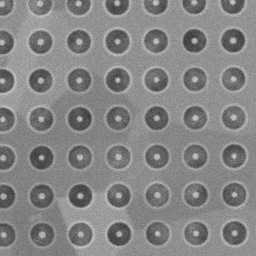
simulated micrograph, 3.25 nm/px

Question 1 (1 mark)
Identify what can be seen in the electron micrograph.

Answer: an array of small figures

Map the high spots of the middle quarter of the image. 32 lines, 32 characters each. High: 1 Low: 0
11111111111111111111111111111111
11000011111100001111100001111110
10000001111000001111000000111100
10000001110000000111000000111100
10000001110000000111000000111100
10000001111000001111000000111100
11000011111000011111100001111110
11111111111111111111111111111111
11111111111111111111111111111111
11111111111111111111111111111111
11111111111110111111111111111111
11000011111000001111100001111110
10000001111000001111000000111100
10000001110001000111000100111100
10000001111000001111000000111100
10000001111000001111100000111110
11000011111110111111111011111111
11111111111111111111111111111111
11111111111111111111111111111111
11111111111111111111111111111111
11100111111100011111110001111110
11000011111000001111100000111100
10000001111000000111000000111100
10000001110001000111000100111100
10000001111000001111100000111100
11000011111000001111100001111110
11111111111111111111111111111111
11111111111111111111111111111111
11111111111111111111111111111111
11111111111111111111111111111111
11000011111100001111100001111110
10000001111000001111100000111100